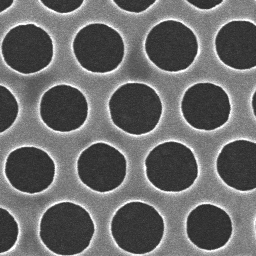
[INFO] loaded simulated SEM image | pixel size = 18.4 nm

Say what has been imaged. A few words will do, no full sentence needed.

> a regular array of holes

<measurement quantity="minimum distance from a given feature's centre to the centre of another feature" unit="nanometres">1280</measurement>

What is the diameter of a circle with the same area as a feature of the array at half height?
930 nm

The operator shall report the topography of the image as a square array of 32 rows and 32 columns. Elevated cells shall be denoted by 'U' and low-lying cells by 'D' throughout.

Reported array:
DUUUUDDDDDUUUUUDDDDUUUUUDDDUUUUU
UUUUUUUDDUUUUUUUDDUUUUUUUUUUUUUU
UUUUUUUUUUUUUUUUUUUUUUUUUUUUUUUU
UUDDDUUUUUDDDDUUUUUDDDDDUUUUDDDD
UDDDDDUUUDDDDDDUUUDDDDDDUUUDDDDD
DDDDDDDUUDDDDDDUUUDDDDDDDUUDDDDD
DDDDDDDUUDDDDDDDUUDDDDDDDUUDDDDD
UDDDDDUUUUDDDDDUUUUDDDDDUUUUDDDD
UDDDDDUUUUDDDDUUUUUUDDDUUUUUUDDU
UUUUUUUUUUUUUUUUUUUUUUUUUUUUUUUU
UUUUUUUUUUUUUUUUDDUUUUUUDDDUUUUU
DUUUUUDDDDUUUUDDDDDUUUUDDDDDUUUU
DDUUUDDDDDDUUUDDDDDDUUUDDDDDDUUU
DDUUUDDDDDDUUUDDDDDDUUUDDDDDDUUU
DDUUUDDDDDDUUUDDDDDDUUUDDDDDDUUU
DDUUUUDDDDUUUUDDDDDDUUUUDDDDUUUU
UUUUUUUUUUUUUUUUDDDUUUUUUUUUUUUU
UUUUUUUUUUUUUUUUUUUUUUUUUUUUUUUU
UUDDDUUUUUUDDDUUUUUDDDDUUUUUDDDD
UDDDDDUUUUDDDDDUUUDDDDDDUUUDDDDD
UDDDDDDUUUDDDDDDUUDDDDDDDUUDDDDD
UDDDDDDUUUDDDDDDUUDDDDDDDUUDDDDD
UDDDDDDUUUDDDDDUUUUDDDDDUUUUDDDD
UUDDDDUUUUUDDDUUUUUUDDDUUUUUUDDD
UUUUUUUUUUUUUUUUUUUUUUUUUUUUUUUU
UUUUUUUDDUUUUUUUDDUUUUUUUUUUUUUU
DUUUUUDDDDDUUUUDDDDDUUUUDDDDUUUU
DDUUUDDDDDDDUUDDDDDDUUUDDDDDDUUU
DDUUUDDDDDDDUUDDDDDDDUUDDDDDDUUU
DDUUUDDDDDDDUUDDDDDDUUUDDDDDDUUU
DDUUUDDDDDDUUUUDDDDDUUUUDDDDUUUU
DUUUUUUDDDUUUUUUDDDUUUUUUUUUUUUU